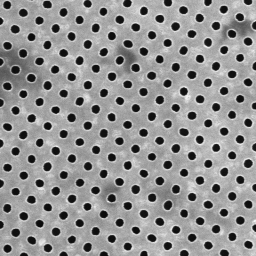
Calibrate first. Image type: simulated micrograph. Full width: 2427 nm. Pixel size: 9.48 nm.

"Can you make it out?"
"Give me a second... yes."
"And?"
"a regular array of holes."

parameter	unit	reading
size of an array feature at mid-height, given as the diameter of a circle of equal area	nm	79.3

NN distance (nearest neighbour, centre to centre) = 168 nanometers